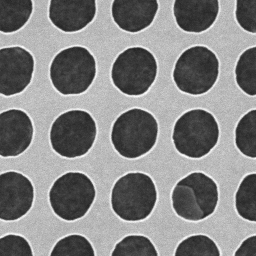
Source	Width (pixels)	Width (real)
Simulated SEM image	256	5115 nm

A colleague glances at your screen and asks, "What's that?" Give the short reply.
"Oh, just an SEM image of a regular array of holes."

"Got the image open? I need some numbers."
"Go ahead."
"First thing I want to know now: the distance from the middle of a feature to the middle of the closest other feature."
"1230 nm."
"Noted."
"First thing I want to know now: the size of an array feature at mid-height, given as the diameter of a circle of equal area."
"942 nm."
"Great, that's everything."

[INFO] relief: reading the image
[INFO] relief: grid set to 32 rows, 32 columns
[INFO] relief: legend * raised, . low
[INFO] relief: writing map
....**......**......**.....***..
....**......**......**.....**...
...***......**.....***.....***..
...****...*****...*****...****..
********************************
********************************
....****...****....****...*****.
....***.....**.....***.....***..
....**......**......**.....**...
....**......**......**.....**...
....***....***.....***.....***..
..*****...*****...*****...*****.
********************************
********************************
...****....****....****....***..
....***.....**......**.....***..
....**......**......**.....**...
....**......**......**.....**...
...****....***.....***.....***..
..******..*****..******...*****.
********************************
*.*******.**********************
....***....****....****....***..
....**......**.....***.....***..
....**......**......*......***..
....**.....***.....***.....**...
...****....***.....***.....***..
********.*******..*****..******.
********************************
*..*****..******..******..******
....***....****....***.....***..
....**......**......**.....**...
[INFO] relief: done